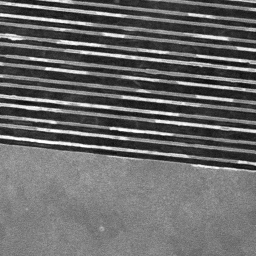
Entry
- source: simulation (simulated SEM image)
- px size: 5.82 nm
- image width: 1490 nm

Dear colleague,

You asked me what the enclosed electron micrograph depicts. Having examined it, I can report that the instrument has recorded parallel lines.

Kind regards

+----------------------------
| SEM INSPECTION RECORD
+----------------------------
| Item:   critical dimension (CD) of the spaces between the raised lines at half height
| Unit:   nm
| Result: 36.9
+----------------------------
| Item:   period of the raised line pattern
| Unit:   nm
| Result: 59.1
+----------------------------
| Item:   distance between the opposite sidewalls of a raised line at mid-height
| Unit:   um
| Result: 0.0159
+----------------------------